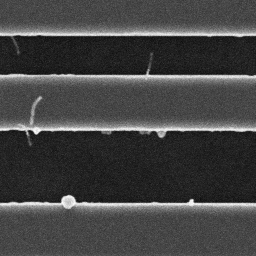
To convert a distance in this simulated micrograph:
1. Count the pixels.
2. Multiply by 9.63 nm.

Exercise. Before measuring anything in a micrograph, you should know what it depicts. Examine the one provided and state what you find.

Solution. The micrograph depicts lines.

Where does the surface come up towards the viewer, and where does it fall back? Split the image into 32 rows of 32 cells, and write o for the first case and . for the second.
oooooooooooooooooooooooooooooooo
oooooooooooooooooooooooooooooooo
oooooooooooooooooooooooooooooooo
oooooooooooooooooooooooooooooooo
.............................o..
................................
................................
................................
................................
ooooooooooooooooooooooooooooo...
oooooooooooooooooooooooooooooooo
oooooooooooooooooooooooooooooooo
oooooooooooooooooooooooooooooooo
oooooooooooooooooooooooooooooooo
oooooooooooooooooooooooooooooooo
oooooooooooooooooooooooooooooooo
....o...........................
................................
................................
................................
................................
................................
................................
................................
........o.......................
oooooooooooooooooooooooooooooooo
oooooooooooooooooooooooooooooooo
oooooooooooooooooooooooooooooooo
oooooooooooooooooooooooooooooooo
oooooooooooooooooooooooooooooooo
oooooooooooooooooooooooooooooooo
oooooooooooooooooooooooooooooooo